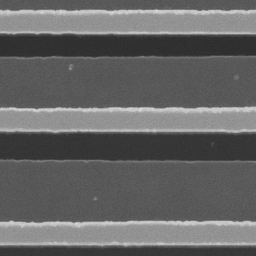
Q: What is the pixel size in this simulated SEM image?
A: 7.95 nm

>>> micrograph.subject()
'lines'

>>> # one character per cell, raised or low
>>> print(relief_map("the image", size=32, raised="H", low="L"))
HHHHHHHHHHHHHHHHHHHHHHHHHHHHHHHH
HHHHHHHHHHHHHHHHHHHHHHHHHHHHHHHH
HHHHHHHHHHHHHHHHHHHHHHHHHHHHHHHH
HHHHHHHHHHHHHHHHHHHHHHHHHHHHHHHH
LLLLLLLLLLLLLLLLLLLLLLLLLLLLLLLL
LLLLLLLLLLLLLLLLLLLLLLLLLLLLLLLL
LLLLLLLLLLLLLLLLLLLLLLLLLLLLLLLL
HHHHHHHHHHHHHHHHHHHHHHHHHHHHHHHH
HHHHHHHHHHHHHHHHHHHHHHHHHHHHHHHH
HHHHHHHHHHHHHHHHHHHHHHHHHHHHHHHH
HHHHHHHHHHHHHHHHHHHHHHHHHHHHHHHH
HHHHHHHHHHHHHHHHHHHHHHHHHHHHHHHH
HHHHHHHHHHHHHHHHHHHHHHHHHHHHHHHH
HHHHHHHHHHHHHHHHHHHHHHHHHHHHHHHH
HHHHHHHHHHHHHHHHHHHHHHHHHHHHHHHH
HHHHHHHHHHHHHHHHHHHHHHHHHHHHHHHH
LLLLLLHHLLLLLLLLLLHHLLLLLLLLHHHH
LLLLLLLLLLLLLLLLLLLLLLLLLLLLLLLL
LLLLLLLLLLLLLLLLLLLLLLLLLLLLLLLL
LLLLLLLLLLLLLLLLLLLLLLLLLLLLLLLL
HHHHHHHHHHHHHHHHHHHHHHHHHHHHHHHH
HHHHHHHHHHHHHHHHHHHHHHHHHHHHHHHH
HHHHHHHHHHHHHHHHHHHHHHHHHHHHHHHH
HHHHHHHHHHHHHHHHHHHHHHHHHHHHHHHH
HHHHHHHHHHHHHHHHHHHHHHHHHHHHHHHH
HHHHHHHHHHHHHHHHHHHHHHHHHHHHHHHH
HHHHHHHHHHHHHHHHHHHHHHHHHHHHHHHH
HHHHHHHHHHHHHHHHHHHHHHHHHHHHHHHH
HHHHHHHHHHHHHHHHHHHHHHHHHHHHHHHH
HHHHHHHHHHHHHHHHHHHHHHHHHHHHHHHH
HHHHHHHHHHHHHHHHHHHHHHHHHHHHHHHH
LLLLLLLLLLLLLLLLLLLLLLLLLLLLLLLL